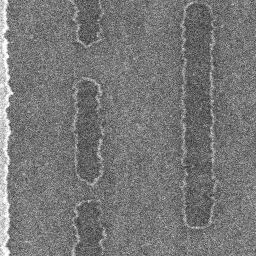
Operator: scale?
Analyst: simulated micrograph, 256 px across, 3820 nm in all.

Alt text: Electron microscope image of one or a few lines or trenches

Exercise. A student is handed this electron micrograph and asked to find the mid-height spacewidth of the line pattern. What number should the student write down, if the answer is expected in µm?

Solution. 1.14